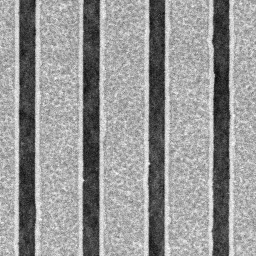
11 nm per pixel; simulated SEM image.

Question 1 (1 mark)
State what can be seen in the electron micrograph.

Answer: one or a few lines or trenches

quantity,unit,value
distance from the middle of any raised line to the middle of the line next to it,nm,716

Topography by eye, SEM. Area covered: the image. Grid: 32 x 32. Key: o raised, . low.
oo...ooooo...ooooo...ooooo...ooo
oo...ooooo...ooooo...ooooo...ooo
oo...ooooo...ooooo...ooooo...ooo
oo...ooooo...ooooo...ooooo...ooo
oo...ooooo...ooooo...ooooo...ooo
oo...ooooo...ooooo...ooooo...ooo
oo...ooooo...ooooo...ooooo...ooo
oo...ooooo...ooooo...ooooo...ooo
oo...ooooo...ooooo...ooooo...ooo
oo...ooooo...ooooo...ooooo...ooo
oo...ooooo...ooooo...ooooo...ooo
oo...ooooo...ooooo...ooooo...ooo
oo...ooooo...ooooo...ooooo...ooo
oo...ooooo...ooooo...ooooo...ooo
oo...ooooo...ooooo...ooooo...ooo
oo...ooooo...ooooo...ooooo...ooo
oo...ooooo...ooooo...ooooo...ooo
oo...ooooo...ooooo...ooooo...ooo
oo...ooooo...ooooo...ooooo...ooo
oo...ooooo...ooooo...ooooo...ooo
oo...ooooo...ooooo...ooooo...ooo
oo...ooooo...ooooo...ooooo...ooo
oo...ooooo...ooooo...ooooo...ooo
oo...ooooo...ooooo...ooooo...ooo
oo...ooooo...ooooo...ooooo...ooo
oo...ooooo...ooooo...ooooo...ooo
oo...ooooo...ooooo...ooooo...ooo
oo...ooooo...ooooo...ooooo...ooo
oo...ooooo...ooooo...ooooo...ooo
oo...ooooo...ooooo...ooooo...ooo
oo...ooooo...ooooo...ooooo...ooo
oo...ooooo...ooooo...ooooo...ooo